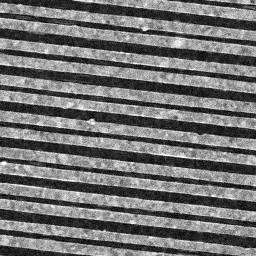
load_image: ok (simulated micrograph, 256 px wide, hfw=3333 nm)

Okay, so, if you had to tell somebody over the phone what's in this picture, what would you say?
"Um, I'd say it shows parallel lines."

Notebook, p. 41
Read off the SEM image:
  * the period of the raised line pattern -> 234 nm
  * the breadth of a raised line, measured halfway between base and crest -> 0.129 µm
